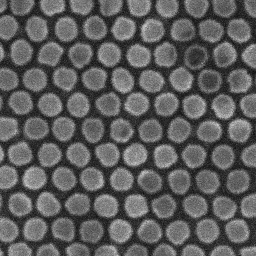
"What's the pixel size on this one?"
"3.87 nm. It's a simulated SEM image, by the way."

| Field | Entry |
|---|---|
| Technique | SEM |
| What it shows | a regular array of raised bodies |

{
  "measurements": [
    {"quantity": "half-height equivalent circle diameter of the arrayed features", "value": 86.6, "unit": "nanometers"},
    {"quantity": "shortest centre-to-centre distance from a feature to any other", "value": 0.108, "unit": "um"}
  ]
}